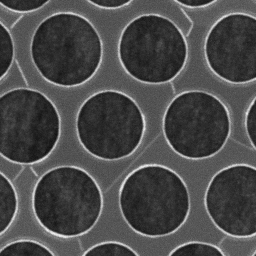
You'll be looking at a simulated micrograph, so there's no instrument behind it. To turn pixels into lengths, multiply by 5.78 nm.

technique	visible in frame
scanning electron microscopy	holes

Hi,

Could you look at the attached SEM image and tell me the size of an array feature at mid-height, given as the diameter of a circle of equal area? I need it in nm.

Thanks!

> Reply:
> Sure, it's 394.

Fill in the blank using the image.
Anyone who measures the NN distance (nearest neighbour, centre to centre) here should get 500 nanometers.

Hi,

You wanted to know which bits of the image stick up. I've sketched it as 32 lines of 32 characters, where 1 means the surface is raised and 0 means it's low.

00000011111100001111111000111111
11111111111111111111111111111111
11111100000111111000011111110000
01111000000011110000001111100000
01110000000011100000000111000000
00110000000001100000000111000000
00110000000001100000000111000000
00110000000001100000000111000000
01111000000011110000000111000000
11111000000111111000001111100000
11111110001111111111111111111111
10000111111110011111111001111111
00000011111000001111110000011111
00000001110000000111100000001110
00000001110000000011100000000110
00000001110000000011000000000110
00000001110000000011100000000110
00000001110000000011100000001110
00000001111000000111110000001111
10000011111100001111111000111111
11111111111111111111111111111111
11111100001111111000001111110000
01111000000011110000000111100000
00110000000011100000000111000000
00110000000001100000000111000000
00110000000001100000000011000000
00110000000011100000000111000000
01111000000011110000000111100000
01111100000111111000001111100000
11111111011111111111111111111001
10000111111110011111111100111111
00000011111000000111110000001111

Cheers